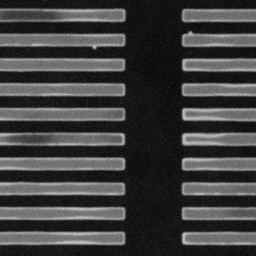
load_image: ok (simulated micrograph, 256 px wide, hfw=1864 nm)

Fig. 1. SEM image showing groups of lines, slits or small figures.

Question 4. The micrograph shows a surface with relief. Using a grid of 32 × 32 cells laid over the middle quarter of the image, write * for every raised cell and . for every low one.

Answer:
***************...............**
********...****.................
................................
................................
................................
***************...............**
***************...............**
***************...............**
................................
................................
................................
***************...............**
***************...............**
***************...............**
................................
................................
................................
***********.....................
***************...............**
***************...............**
................................
................................
................................
................................
***************...............**
***************...............**
**...........**...............**
................................
................................
................................
***************...............**
***************...............**